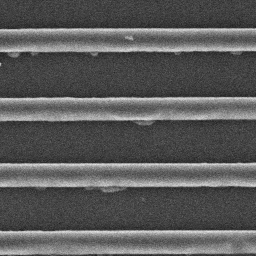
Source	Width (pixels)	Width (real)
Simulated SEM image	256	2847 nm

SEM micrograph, lines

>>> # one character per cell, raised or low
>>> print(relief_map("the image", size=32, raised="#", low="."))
................................
................................
................................
................................
################################
################################
................................
................................
................................
................................
................................
................................
################################
################################
################################
................................
................................
................................
................................
................................
...........###.#################
################################
################################
................................
................................
................................
................................
................................
................................
################################
################################
####..........##########........